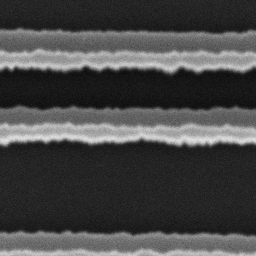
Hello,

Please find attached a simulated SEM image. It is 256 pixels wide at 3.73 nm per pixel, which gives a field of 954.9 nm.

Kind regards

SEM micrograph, lines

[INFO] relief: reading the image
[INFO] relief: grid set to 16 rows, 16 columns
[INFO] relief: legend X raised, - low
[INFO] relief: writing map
----------------
----------------
XXXXXXXXXXXXXXXX
XXXXXXXXXXXXXXXX
----------------
----------------
----------------
XXXXXXXXXXXXXXXX
XXXXXXXXXXXXXXXX
----------------
----------------
----------------
----------------
----------------
----------------
XXXXXXXXXXXXXXXX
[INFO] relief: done